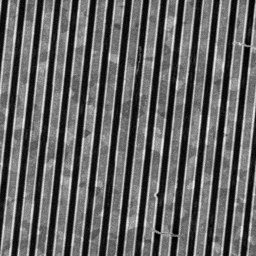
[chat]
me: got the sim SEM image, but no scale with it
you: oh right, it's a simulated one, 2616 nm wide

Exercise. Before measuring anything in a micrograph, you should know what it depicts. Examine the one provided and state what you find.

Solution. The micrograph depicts parallel lines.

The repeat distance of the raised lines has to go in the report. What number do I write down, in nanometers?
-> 179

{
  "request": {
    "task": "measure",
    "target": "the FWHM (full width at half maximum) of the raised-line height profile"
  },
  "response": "95.3 nm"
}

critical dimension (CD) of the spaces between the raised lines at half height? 86.4 nanometres